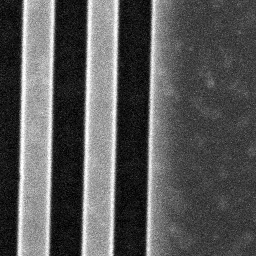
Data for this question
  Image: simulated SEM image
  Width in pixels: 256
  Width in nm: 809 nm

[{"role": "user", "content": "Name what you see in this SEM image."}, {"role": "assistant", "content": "parallel lines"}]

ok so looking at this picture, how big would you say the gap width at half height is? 111 nm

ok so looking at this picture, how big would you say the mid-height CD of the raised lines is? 92.5 nanometers